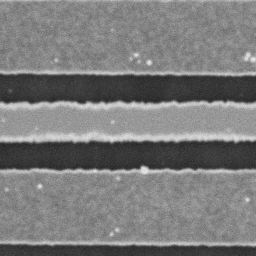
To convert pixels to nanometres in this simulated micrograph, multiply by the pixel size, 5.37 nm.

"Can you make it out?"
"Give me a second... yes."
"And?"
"lines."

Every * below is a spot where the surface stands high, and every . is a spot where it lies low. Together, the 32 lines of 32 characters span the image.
********************************
********************************
********************************
********************************
********************************
********************************
********************************
********************************
********************************
................................
................................
................................
................................
********************************
********************************
********************************
********************************
***********.****.******..*..****
................................
................................
................................
********************************
********************************
********************************
********************************
********************************
********************************
********************************
********************************
********************************
.*.*****************************
................................